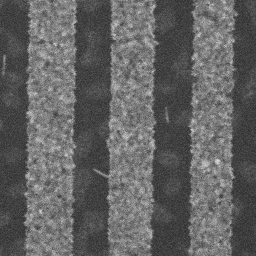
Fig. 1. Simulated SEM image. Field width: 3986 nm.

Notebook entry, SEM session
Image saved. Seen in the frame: one or a few lines or trenches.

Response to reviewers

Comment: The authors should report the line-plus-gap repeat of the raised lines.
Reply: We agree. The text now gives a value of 1250 nanometers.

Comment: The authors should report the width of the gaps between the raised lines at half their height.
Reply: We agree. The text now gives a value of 592 nm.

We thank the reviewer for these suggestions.